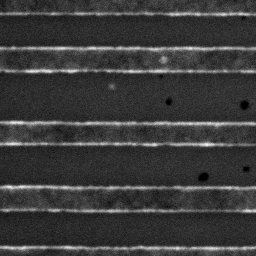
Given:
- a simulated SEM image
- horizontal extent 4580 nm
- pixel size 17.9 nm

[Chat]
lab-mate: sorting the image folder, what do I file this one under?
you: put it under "lines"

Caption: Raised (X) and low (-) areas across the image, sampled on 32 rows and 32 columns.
XXXXXXXXXXXXXXXXXXXXXXXXXXXXXXXX
XXXXXXXXXXXXXXXXXXXXXXXXXXXXXXXX
--------------------------------
--------------------------------
--------------------------------
--------------------------------
XXXXXXXXXXXXXXXXXXXXXXXXXXXXXXXX
XXXXXXXXXXXXXXXXXXXXXXXXXXXXXXXX
XXXXXXXXXXXXXXXXXXXXXXXXXXXXXXXX
--------------------------------
--------------------------------
--------------------------------
--------------------------------
--------------------------------
--------------------------------
XXXXXXXXXXXXXXXXXXXXXXXXXXXXXXXX
XXXXXXXXXXXXXXXXXXXXXXXXXXXXXXXX
XXXXXXXXXXXXXXXXXXXXXXXXXXXXXXXX
--------------------------------
--------------------------------
--------------------------------
--------------------------------
--------------------------------
XXXXXXXXXXXXXXXXXXXXXXXXXXXXXX-X
XXXXXXXXXXXXXXXXXXXXXXXXXXXXXXXX
XXXXXXXXXXXXXXXXXXXXXXXXXXXXXXXX
--------------------------------
--------------------------------
--------------------------------
--------------------------------
--------------------------------
XXXXXXXXXXXXXXXXXXXXXXXXXXXXXXXX